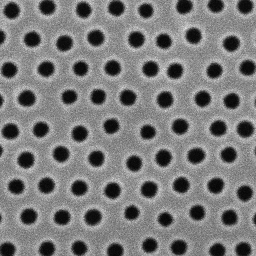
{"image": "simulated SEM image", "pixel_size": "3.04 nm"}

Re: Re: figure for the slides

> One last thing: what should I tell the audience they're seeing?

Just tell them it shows a regular array of holes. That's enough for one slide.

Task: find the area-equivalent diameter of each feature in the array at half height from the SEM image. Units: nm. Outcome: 49.7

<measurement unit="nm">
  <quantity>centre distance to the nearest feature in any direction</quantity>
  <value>91.1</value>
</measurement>